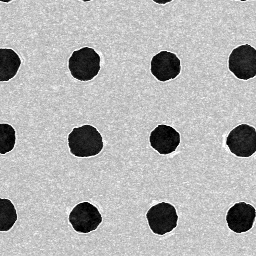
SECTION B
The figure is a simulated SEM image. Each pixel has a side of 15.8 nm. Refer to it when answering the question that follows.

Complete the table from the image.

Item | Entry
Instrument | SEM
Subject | holes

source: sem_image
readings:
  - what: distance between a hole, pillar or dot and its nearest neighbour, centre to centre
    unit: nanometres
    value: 1210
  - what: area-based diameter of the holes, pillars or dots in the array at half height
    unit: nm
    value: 496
